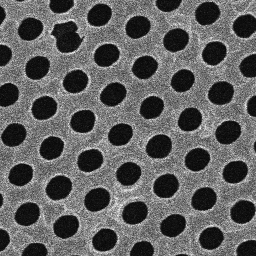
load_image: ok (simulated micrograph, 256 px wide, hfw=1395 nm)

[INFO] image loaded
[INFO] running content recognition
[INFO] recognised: a regular array of holes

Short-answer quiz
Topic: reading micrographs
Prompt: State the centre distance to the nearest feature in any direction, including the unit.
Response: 217 nm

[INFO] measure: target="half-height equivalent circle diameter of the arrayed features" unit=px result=23.9